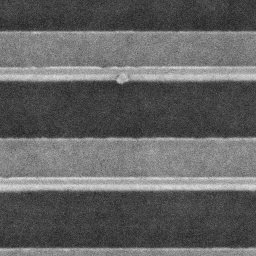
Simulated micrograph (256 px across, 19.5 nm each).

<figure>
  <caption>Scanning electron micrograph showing lines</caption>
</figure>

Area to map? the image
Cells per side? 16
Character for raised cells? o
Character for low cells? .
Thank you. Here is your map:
................
................
oooooooooooooooo
oooooooooooooooo
oooooooooooooooo
................
................
................
................
oooooooooooooooo
oooooooooooooooo
oooooooooooooooo
................
................
................
................